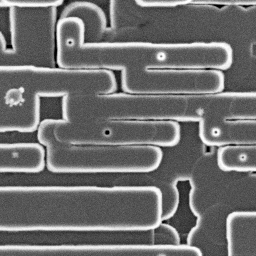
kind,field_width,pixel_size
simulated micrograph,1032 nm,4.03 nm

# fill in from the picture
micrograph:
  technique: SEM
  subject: wiring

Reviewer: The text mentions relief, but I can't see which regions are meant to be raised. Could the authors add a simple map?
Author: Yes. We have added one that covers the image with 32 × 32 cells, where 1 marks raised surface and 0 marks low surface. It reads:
01111110000000000011111000000000
00000000000000000000000000000000
00000000110000000000000000000000
00000001110000000000000000000000
00000001110000000000000000000000
00000001111000000000000000000000
00000001111111111111111111111000
00000001111111111111111111111000
00110001111111111111111111110000
11111111111111011111111111110000
11111111111111011111111111110000
11111111111111111111111111110000
11111000111111111111111111111111
11111000111111111111111111111111
11111000111111111111111111111111
11111111111111111111110001111111
00000111111111111111110001111111
00000111111111111111110001111111
11111011111111111111000000001111
11111011111111111111000000001111
11111011111111111111000000001111
00000000000000000000000000000000
00000000000000000000000000000000
00000011011100000010000000000000
11111111111111111111000000000000
11111111111111111111000000000000
11111111111111111111000000000000
11111111111111111111000000001111
11111111111111111110000000001111
00000000000000000000000000001111
00000000000000000000000000000111
11111111111111111111111110000111